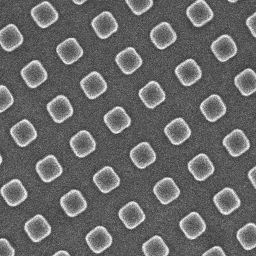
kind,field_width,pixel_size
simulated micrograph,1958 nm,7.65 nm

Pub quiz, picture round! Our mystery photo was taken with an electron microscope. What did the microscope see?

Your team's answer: a regular array of raised bodies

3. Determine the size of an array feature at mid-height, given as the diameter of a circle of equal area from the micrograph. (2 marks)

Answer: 184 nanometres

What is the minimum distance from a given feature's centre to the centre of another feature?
322 nm